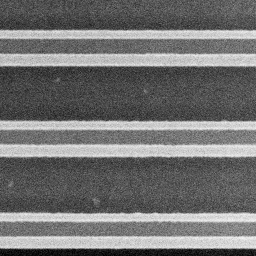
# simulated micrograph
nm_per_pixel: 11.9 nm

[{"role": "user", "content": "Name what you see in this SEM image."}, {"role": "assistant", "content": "lines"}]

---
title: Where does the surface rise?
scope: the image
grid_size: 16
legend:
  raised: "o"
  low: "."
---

................
................
oooooooooooooooo
oooooooooooooooo
................
................
................
................
oooooooooooooooo
oooooooooooooooo
................
................
................
oooooooooooooooo
oooooooooooooooo
................